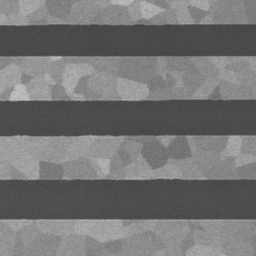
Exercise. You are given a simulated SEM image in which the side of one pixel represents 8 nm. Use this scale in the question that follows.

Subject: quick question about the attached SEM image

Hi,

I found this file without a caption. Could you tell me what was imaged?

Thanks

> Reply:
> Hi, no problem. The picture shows lines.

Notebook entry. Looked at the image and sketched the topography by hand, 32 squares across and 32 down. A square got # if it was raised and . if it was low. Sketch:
################################
################################
################################
................................
................................
................................
................................
################################
################################
################################
################################
################################
................................
................................
................................
................................
................................
################################
################################
################################
################################
################################
................................
................................
................................
................................
................................
................................
################################
################################
################################
################################